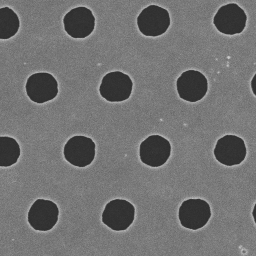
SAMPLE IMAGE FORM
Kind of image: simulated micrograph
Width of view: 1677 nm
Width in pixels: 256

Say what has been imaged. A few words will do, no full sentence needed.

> a regular array of holes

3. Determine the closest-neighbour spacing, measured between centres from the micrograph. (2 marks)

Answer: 483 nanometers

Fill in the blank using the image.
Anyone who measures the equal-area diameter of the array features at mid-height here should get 31.7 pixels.